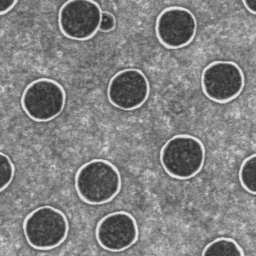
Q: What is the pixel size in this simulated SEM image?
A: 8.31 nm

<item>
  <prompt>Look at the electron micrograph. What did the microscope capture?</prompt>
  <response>a regular array of raised bodies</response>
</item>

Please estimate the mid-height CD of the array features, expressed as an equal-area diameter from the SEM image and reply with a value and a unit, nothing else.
0.342 um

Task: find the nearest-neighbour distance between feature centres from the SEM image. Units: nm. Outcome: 591